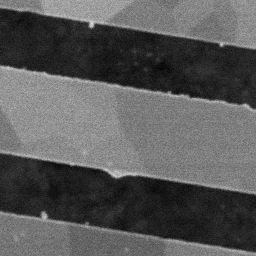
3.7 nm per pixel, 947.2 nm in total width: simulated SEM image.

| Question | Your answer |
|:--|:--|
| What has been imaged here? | one or a few lines or trenches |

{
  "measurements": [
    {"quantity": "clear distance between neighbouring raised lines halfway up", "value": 216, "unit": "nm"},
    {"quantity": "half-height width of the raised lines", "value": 311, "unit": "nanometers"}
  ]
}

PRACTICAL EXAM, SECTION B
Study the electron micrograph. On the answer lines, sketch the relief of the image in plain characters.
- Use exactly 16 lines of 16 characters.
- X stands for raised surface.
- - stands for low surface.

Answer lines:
XXXXXXXXXXXXXXXX
------XXXXXXXXXX
-------------XXX
----------------
XX--------------
XXXXXXXX--------
XXXXXXXXXXXXXX--
XXXXXXXXXXXXXXXX
XXXXXXXXXXXXXXXX
XXXXXXXXXXXXXXXX
------XXXXXXXXXX
------------XXXX
----------------
X---------------
XXXXXXXX--------
XXXXXXXXXXXXXX--